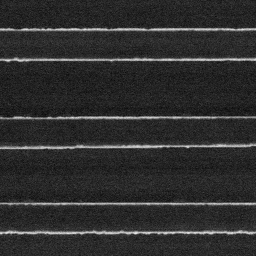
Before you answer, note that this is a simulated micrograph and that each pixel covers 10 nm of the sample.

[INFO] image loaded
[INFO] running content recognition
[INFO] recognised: lines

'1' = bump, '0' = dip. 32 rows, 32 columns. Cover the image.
00000000000000000000000000000000
00000000000000000000000000000000
00000000000000000000000000000000
00000000000000000000000000000000
11111111111111111111111111111111
11111111111111111111111111111111
11111111111111111111111111111111
00000000000000000000000000000000
00000000000000000000000000000000
00000000000000000000000000000000
00000000000000000000000000000000
00000000000000000000000000000000
00000000000000000000000000000000
00000000000000000000000000000000
00000000000000000000000000000000
11111111111111111111111111111111
11111111111111111111111111111111
11111111111111111111111111111111
11111111110000000000000000000000
00000000000000000000000000000000
00000000000000000000000000000000
00000000000000000000000000000000
00000000000000000000000000000000
00000000000000000000000000000000
00000000000000000000000000000000
11111111111111111111111111111111
11111111111111111111111111111111
11111111111111111111111111111111
11111111111111111111111111111111
00000000000000000000000000000000
00000000000000000000000000000000
00000000000000000000000000000000